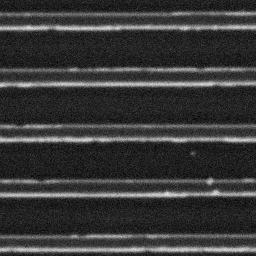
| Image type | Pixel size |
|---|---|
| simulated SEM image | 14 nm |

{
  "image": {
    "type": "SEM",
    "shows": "lines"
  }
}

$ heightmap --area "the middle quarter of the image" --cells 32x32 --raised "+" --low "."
................................
.+++....+++++++++++++++++.++++++
++++++++++++++++++++++++++++++++
++++++++++++++++++++++++++++++++
++++++++++++++++++++++++++++++++
................................
................................
................................
................................
................................
................................
................................
................................
................................
................................
................................
++++++++++++++++++++++++++++++++
++++++++++++++++++++++++++++++++
++++++++++++++++++++++++++++++++
................................
................................
................................
................................
................................
................................
................................
................................
................................
................................
++++++++++++++++++++++++++++++++
++++++++++++++++++++++++++++++++
++++++++++++++++++++++++++++++++